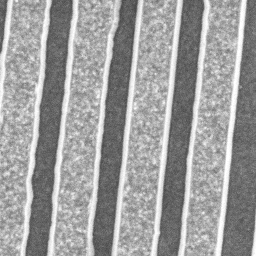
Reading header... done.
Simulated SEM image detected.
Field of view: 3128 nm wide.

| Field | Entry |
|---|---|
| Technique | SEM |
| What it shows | one or a few lines or trenches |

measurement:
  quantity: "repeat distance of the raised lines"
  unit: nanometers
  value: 795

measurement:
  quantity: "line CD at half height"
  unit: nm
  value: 471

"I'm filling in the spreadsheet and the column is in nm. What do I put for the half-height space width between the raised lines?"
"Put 322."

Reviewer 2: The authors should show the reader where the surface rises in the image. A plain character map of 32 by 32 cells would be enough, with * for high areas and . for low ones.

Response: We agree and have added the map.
.*****...******...****....****..
.*****...******..*****....****..
.*****...******..*****....****..
.*****...*****...*****....****..
.*****...*****...*****...*****..
.****....*****...*****...*****..
.****....*****...*****...*****..
*****....*****...*****...*****..
*****....****....*****...*****..
*****....****....*****...*****..
*****....****....****....*****..
*****...*****...*****....****...
*****...*****...*****....****...
*****...*****...*****....****...
*****...*****...*****...*****...
*****...*****...*****...*****...
****....*****...*****...*****...
****....****....*****...*****...
****....****....*****...*****...
****...*****....*****...*****...
****...*****....****....****....
****...*****...*****....****....
****...*****...*****....****....
****...*****...*****...*****....
****...*****...*****...*****....
****...*****...*****...*****....
***....*****...*****...*****....
***....****....*****...*****....
***....****....*****...*****....
***....****....*****...*****....
***...*****...*****....****.....
***...*****...*****....****.....